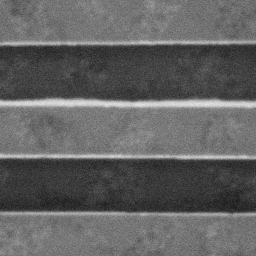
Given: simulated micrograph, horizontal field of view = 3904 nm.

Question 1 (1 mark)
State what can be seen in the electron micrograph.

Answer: lines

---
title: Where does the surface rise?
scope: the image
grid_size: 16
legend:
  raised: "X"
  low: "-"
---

XXXXXXXXXXXXXXXX
XXXXXXXXXXXXXXXX
XXXXXXXXXXXXXXXX
----------------
----------------
----------------
----------------
XXXXXXXXXXXXXXXX
XXXXXXXXXXXXXXXX
XXXXXXXXXXXXXXXX
----------------
----------------
----------------
XXXXXXXXXXXXXXXX
XXXXXXXXXXXXXXXX
XXXXXXXXXXXXXXXX